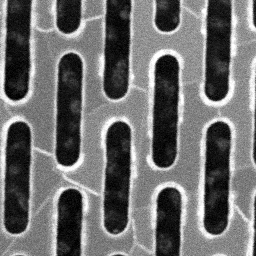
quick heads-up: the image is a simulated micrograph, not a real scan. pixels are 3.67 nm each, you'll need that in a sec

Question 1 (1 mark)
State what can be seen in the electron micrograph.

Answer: holes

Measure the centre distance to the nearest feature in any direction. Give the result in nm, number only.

305